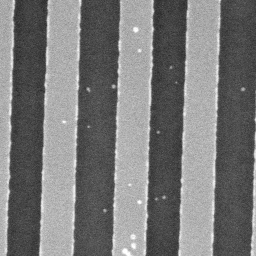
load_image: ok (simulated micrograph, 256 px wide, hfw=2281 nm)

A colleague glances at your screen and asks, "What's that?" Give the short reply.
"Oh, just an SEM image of lines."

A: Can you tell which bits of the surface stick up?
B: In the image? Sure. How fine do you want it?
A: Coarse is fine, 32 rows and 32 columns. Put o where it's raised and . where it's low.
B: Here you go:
oo....oooo.....oooo.....oooo....
oo....oooo.....oooo....oooo.....
oo....oooo.....oooo....oooo.....
oo....oooo.....oooo....oooo.....
oo....oooo.....oooo....oooo.....
oo....oooo.....oooo....oooo.....
oo....oooo.....oooo....oooo.....
oo....oooo.....oooo....oooo.....
oo....oooo.....oooo....oooo.....
o.....oooo.....oooo....oooo.....
o.....oooo.....oooo....oooo.....
o.....oooo.....oooo....oooo.....
o.....oooo.....oooo....oooo.....
o.....oooo.....oooo....oooo.....
o.....oooo.....oooo....oooo.....
o.....oooo.....oooo....oooo.....
o.....oooo.....oooo....oooo.....
o.....oooo.....oooo....oooo.....
o....ooooo....ooooo....oooo.....
o....oooo.....oooo.....oooo.....
o....oooo.....oooo.....oooo.....
o....oooo.....oooo.....oooo.....
o....oooo.....oooo.....oooo.....
o....oooo.....oooo.....oooo.....
o....oooo.....oooo.....oooo.....
o....oooo.....oooo.....oooo.....
o....oooo.....oooo.....oooo.....
o....oooo.....oooo.....oooo.....
o....oooo.....oooo.....oooo.....
o....oooo.....oooo....ooooo.....
o....oooo.....oooo....ooooo....o
o....oooo.....oooo....oooo.....o